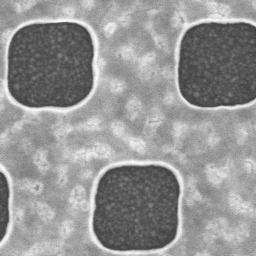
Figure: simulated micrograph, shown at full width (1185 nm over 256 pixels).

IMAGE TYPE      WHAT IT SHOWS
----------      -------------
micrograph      holes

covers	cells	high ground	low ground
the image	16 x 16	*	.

****************
**...*******....
*.....*****.....
......*****.....
......*****.....
......*****.....
*....*******...*
****************
****************
****************
*******....*****
.*****.....*****
.*****.....*****
.*****.....*****
******.....*****
*******...******